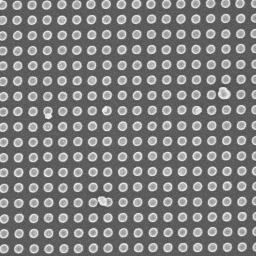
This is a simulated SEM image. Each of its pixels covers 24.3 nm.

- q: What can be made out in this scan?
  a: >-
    a regular array of raised bodies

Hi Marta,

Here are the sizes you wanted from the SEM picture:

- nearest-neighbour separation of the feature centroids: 352 nm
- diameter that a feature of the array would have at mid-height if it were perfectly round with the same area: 209 nm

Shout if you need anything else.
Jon